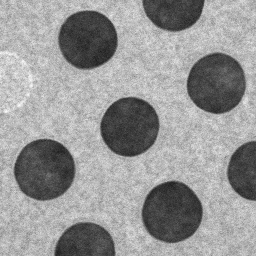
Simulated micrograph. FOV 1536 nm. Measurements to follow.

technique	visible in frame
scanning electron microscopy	holes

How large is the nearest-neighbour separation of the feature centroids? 95.5 pixels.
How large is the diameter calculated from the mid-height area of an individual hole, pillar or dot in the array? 0.359 microns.